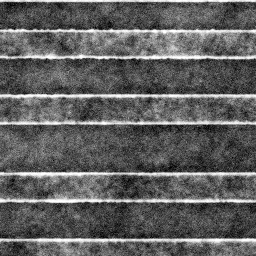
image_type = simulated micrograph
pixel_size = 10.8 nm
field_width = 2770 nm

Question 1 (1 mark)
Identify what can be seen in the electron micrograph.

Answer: lines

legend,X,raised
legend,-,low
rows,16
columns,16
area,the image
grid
----------------
----------------
XXXXXXXXXXXXXXXX
XXXXXXXXXXXXXXXX
----------------
----------------
XXXXXXXXXXXXXXXX
XXXXXXXXXXXXXXXX
----------------
----------------
----------------
XXXXXXXXXXXXXXXX
XXXXXXXXXXXXXXXX
----------------
----------------
XXXXXXXXXXXXXXXX